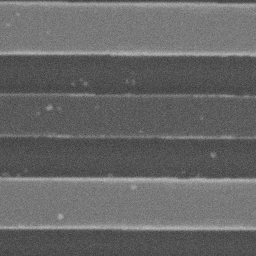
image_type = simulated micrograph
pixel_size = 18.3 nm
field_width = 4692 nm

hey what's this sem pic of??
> lines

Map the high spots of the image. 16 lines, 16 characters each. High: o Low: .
oooooooooooooooo
oooooooooooooooo
oooooooooooooooo
................
................
................
oooooooooooooooo
oooooooooooooooo
...ooooooooooooo
................
................
oooooooooooooooo
oooooooooooooooo
oooooooooooooooo
................
................